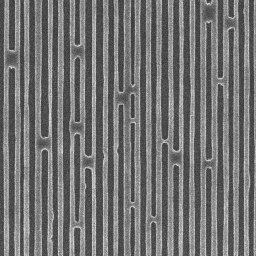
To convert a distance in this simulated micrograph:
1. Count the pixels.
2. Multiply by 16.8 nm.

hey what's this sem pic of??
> parallel lines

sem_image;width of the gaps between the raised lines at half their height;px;6.25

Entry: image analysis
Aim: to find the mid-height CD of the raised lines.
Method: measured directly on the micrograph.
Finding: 4.75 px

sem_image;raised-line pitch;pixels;10.9